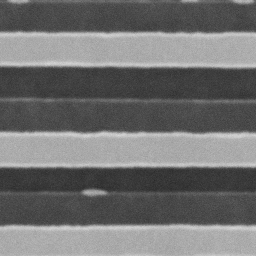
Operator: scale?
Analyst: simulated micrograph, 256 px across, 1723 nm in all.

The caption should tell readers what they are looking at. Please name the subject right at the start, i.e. lines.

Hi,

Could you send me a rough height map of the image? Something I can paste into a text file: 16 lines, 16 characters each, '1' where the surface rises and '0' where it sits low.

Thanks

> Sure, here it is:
0000000000000000
0000000000000000
1111111111111111
1111111111111111
0000000000000000
0000000000000000
0000000000000000
0000000000000000
1111111111111111
1111111111111111
0000000000000000
0000000000000000
0000000000000000
0000000000000000
1111111111111111
1111111111111111